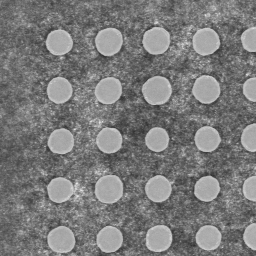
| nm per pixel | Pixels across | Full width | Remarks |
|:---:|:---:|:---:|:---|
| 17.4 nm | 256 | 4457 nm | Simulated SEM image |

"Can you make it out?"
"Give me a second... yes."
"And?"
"a regular array of raised bodies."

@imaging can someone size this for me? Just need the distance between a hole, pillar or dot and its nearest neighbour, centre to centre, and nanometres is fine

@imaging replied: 841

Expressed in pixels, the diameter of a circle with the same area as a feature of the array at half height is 26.